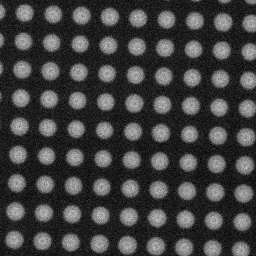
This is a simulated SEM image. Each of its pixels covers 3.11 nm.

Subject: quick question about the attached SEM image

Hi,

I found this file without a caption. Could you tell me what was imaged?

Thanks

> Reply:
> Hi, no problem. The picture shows an array of small figures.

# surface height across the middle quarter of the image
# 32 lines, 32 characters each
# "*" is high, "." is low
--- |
..***.....**....................
..****...****...****....**.....*
..****...****...****...****...**
..***....****...****...****...**
.................**....****...**
...............................*
................................
..***.....*.....................
.****....***....***....***.....*
.****...****...*****...****...**
..***....***...*****...****...**
..........*.....***....***....**
...............................*
................................
..**............................
.****...****....***....***......
.****...****...****...****....**
.****...****...****...****...***
.........**.....***...****....**
...............................*
................................
..**............................
.****...***....***.....**.......
.****...****...****...****...***
.***....****...****...****...***
.........**....***....****...***
..............................**
................................
..*.............................
.***....***....***.....**.......
****...****....****...****...***
.***....***...*****...****...***